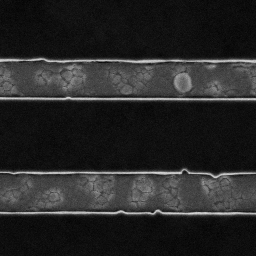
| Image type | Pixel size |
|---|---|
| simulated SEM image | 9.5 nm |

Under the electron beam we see one or a few lines or trenches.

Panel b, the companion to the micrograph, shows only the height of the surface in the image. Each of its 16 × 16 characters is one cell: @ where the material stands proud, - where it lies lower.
@@@@@@@@@@@@@@@@
@@@@@@@@@@@@@@@@
@@@@@@@@@@@@@@@@
@@@@@@@@@@@@@@@@
----------------
----------------
@@@@@@@@@@@@@@@@
@@@@@@@@@@@@@@@@
@@@@@@@@@@@@@@@@
@@@@@@@@@@@@@@@@
@@@@@@@@@@@@@@@@
----------------
----------------
@@@@@@@@@@@@@@@@
@@@@@@@@@@@@@@@@
@@@@@@@@@@@@@@@@